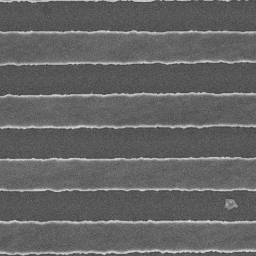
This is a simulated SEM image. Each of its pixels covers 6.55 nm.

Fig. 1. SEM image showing lines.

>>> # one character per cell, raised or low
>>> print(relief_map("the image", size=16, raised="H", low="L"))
LLLLLLLLLLLLLLLL
LLLLLLLLLLLLLLLL
HHHHHHHHHHHHHHHH
HHHHHHHHHHHHHHHH
LLLLLLLLLLLLLLLL
LLLLLLLLLLLLLLLL
HHHHHHHHHHHHHHHH
HHHHHHHHHHHHHHHH
LLLLLLLLLLLLLLLL
LLLLLLLLLLLLLLLL
HHHHHHHHHHHHHHHH
HHHHHHHHHHHHHHHH
LLLLLLLLLLLLLLLL
LLLLLLLLLLLLLLLL
HHHHHHHHHHHHHHHH
HHHHHHHHHHHHHHHH